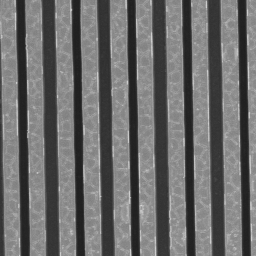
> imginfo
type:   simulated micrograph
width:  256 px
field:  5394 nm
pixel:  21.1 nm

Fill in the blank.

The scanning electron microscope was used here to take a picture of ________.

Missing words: parallel lines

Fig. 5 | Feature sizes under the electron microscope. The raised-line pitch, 27.7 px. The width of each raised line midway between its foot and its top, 17.5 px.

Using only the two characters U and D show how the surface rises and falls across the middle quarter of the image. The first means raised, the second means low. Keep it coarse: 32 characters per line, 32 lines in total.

UUDDUUUUUDDDUUUUDDUUUUDDDDUUUUDD
UUDDUUUUUDDDUUUUDDUUUUDDDDUUUUDD
UUDDDUUUUDDDUUUUDDUUUUDDDDUUUUDD
UUDDDUUUUDDDUUUUDDUUUUDDDDUUUUDD
UUDDDUUUUDDDUUUUDDUUUUDDDDUUUUDD
UUDDDUUUUDDDUUUUDDUUUUDDDDUUUUDD
UUDDDUUUUDDDUUUUDDUUUUDDDDUUUUDD
UUDDDUUUUDDDUUUUDDUUUUDDDDUUUUDD
UUDDDUUUUDDDUUUUDDUUUUDDDDUUUUDD
UUDDDUUUUDDDUUUUDDUUUUDDDDUUUUDD
UUDDDUUUUDDDUUUUDDDUUUDDDDUUUUDD
UUDDDUUUUDDDUUUUDDDUUUDDDDUUUUDD
UUDDDUUUUDDDUUUUDDDUUUDDDDUUUUDD
UUDDDUUUUDDDUUUUDDDUUUUDDDUUUUDD
UUDDDUUUUDDDUUUUDDDUUUUDDDUUUUDD
UUDDDUUUUDDDUUUUDDDUUUUDDDUUUUDD
UUDDDUUUUDDDUUUUDDUUUUUDDDUUUUDD
UUDDDUUUUDDDUUUUDDUUUUUDDDUUUUDD
UUDDDUUUUDDDUUUUDDUUUUUDDDUUUUDD
UUUDDUUUUDDDUUUUDDUUUUUDDDUUUUDD
UUUDDUUUUDDDUUUUDDUUUUUDDDUUUUDD
UUUDDUUUUDDDUUUUDDUUUUUDDDUUUUDD
UUUDDUUUUDDDUUUUDDDUUUUDDDUUUUDD
UUUDDUUUUDDDUUUUDDDUUUUDDDUUUUDD
UUUDDUUUUDDDUUUUDDDUUUUDDDUUUUDD
UUUDDUUUUDDDUUUUDDDUUUUDDDUUUUDD
UUUDDUUUUDDDUUUUUDDUUUUDDDUUUUDD
UUUDDUUUUDDDUUUUUDDUUUUDDDUUUUDD
UUUDDUUUUDDDUUUUUDDUUUUDDDUUUUDD
UUUDDUUUUDDDUUUUUDDUUUUDDDUUUUDD
UUUDDUUUUDDDUUUUUDDUUUUDDDUUUUDD
UUUDDUUUUDDDUUUUUDDUUUUDDDUUUUDD